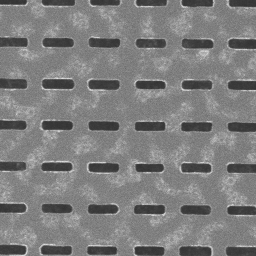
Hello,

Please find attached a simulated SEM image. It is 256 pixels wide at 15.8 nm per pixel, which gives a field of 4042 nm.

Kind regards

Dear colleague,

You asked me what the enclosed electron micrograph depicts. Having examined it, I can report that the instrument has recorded a regular array of holes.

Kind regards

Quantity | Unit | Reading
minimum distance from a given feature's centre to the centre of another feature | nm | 655